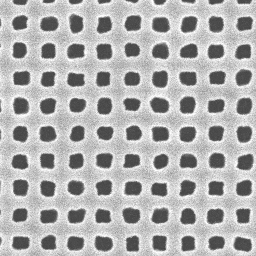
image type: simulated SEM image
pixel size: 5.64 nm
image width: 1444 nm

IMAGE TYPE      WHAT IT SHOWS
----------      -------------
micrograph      a regular array of holes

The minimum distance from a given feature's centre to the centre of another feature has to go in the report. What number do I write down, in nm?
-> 151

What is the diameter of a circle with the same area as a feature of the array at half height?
91.6 nanometres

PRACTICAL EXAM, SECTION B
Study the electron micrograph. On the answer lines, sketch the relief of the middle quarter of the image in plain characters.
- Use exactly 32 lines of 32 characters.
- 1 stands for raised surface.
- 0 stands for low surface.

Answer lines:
11111111111111111111111111111111
11111111111111111111111111111111
10000111000111100001110000111000
10000111000011100001110000111000
10000111000011100001110000111000
11001111100111111011111001111110
11111111111111111111111111111111
11111111111111111111111111111111
11000111100111111111111111111100
11000011000011100001110000111000
10000111000011100001110000111000
11000111000011100011110000111000
11111111100111111111111111111111
11111111111111111111111111111111
11111111111111111111111111111111
11111111111111111011111111111111
11000111000011100001110000111000
11000111000011100000110000111000
10000111100011100001110000111000
11101111111111111111111111111100
11111111111111111111111111111111
11111111111111111111111111111111
11101111100011110111111111111110
10000111000011100001111000111000
10000111000011100001110000111000
10000111100011100011110000111000
11111111111111111111111111111111
11111111111111111111111111111111
11111111111111111111111111111111
10001111000011110001111111111000
10000111000011100000110000111000
10000111000011100001110000111000